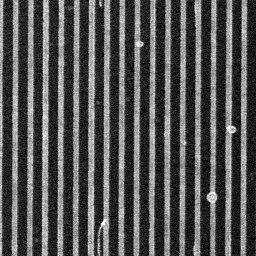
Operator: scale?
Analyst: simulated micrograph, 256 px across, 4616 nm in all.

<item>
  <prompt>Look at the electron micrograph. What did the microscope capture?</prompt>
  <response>parallel lines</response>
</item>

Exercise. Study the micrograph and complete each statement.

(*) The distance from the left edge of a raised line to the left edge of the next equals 275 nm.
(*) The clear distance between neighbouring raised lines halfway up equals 10.9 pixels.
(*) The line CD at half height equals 78.9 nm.